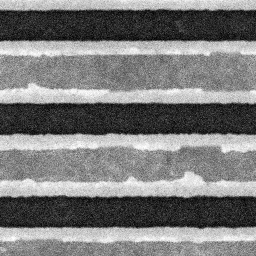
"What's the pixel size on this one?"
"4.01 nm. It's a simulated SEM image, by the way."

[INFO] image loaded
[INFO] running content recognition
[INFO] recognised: one or a few lines or trenches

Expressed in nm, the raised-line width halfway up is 208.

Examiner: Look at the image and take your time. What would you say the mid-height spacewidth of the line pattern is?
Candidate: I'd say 0.164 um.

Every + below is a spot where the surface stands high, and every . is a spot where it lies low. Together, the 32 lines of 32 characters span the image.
+++++++++++++++++++++++++++++.++
................................
................................
................................
................................
................................
++++++++++++++++++++++++++++++++
++++++++++++++++++++++++++++++++
++++++++++++++++++++++++++++++++
++++++++++++++++++++++++++++++++
++++++++++++++++++++++++++++++++
++++++++++++++++++++++++++++++++
................................
................................
................................
................................
................................
........++++.++++++++....+++++++
++++++++++++++++++++++++++++++++
++++++++++++++++++++++++++++++++
++++++++++++++++++++++++++++++++
++++++++++++++++++++++++++++++++
++++++++++++++++++++++++++++++++
++++++++++++++++++++++++++++++++
................................
................................
................................
................................
................................
++++++++++++++++++++++++++++++++
++++++++++++++++++++++++++++++++
++++++++++++++++++++++++++++++++